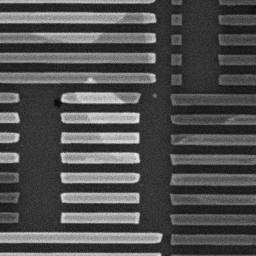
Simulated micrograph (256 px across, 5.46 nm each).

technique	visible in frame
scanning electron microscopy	wiring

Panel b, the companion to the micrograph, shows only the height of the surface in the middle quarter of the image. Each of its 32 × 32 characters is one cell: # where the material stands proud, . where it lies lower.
................................
................................
##########......................
#######################....##...
######################.....##...
................................
................................
.##################.............
###################........#####
.#################.........#####
................................
................................
##################..............
###################........#####
##################.........#####
................................
................................
###################.............
###################........#####
##..###############........#####
................................
................................
##################..............
###################........#####
.#################.........#####
................................
................................
##################..............
###################........#####
...........................#####
................................
................................